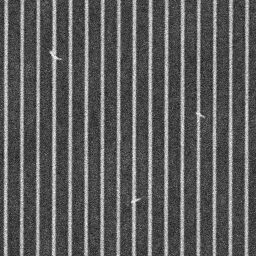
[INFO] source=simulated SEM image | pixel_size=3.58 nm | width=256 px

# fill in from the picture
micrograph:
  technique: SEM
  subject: parallel lines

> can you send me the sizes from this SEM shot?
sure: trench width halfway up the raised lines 13.3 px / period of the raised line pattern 57.5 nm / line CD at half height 9.4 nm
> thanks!